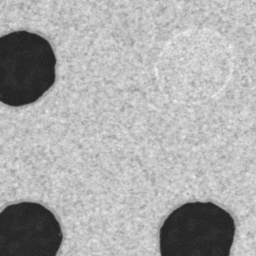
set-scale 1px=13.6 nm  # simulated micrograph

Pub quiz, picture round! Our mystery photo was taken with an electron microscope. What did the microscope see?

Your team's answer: holes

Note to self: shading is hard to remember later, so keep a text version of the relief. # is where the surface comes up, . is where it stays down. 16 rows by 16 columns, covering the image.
################
################
...#############
...#############
...#############
...#############
..##############
################
################
################
################
################
################
...########...##
....######.....#
....######....##